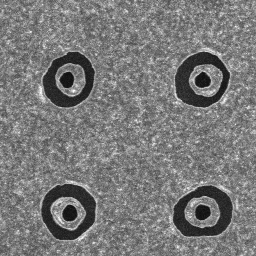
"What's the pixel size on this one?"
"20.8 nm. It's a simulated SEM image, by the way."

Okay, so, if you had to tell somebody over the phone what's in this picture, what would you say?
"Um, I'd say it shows ring-shaped grooves with a dot in the middle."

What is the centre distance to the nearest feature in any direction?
2720 nanometres